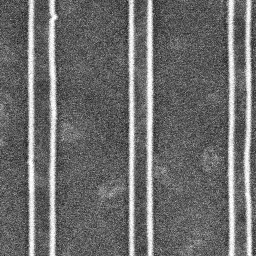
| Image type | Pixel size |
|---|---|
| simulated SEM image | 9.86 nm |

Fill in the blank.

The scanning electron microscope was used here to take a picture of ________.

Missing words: one or a few lines or trenches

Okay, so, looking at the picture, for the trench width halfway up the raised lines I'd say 786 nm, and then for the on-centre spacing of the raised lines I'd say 98.9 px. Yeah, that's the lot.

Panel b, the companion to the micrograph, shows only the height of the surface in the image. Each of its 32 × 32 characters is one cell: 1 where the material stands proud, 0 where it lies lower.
00001100000000001110000000000110
00001110000000001110000000000110
00001110000000001110000000000110
00001100000000001110000000000110
00001100000000001110000000000110
00001100000000001110000000000110
00001100000000001110000000000110
00001100000000001110000000000110
00001110000000001110000000000110
00001110000000001110000000000110
00001110000000001110000000000110
00001110000000001110000000000110
00001110000000001110000000000110
00001110000000001110000000000110
00001110000000001110000000000110
00001110000000001110000000000110
00001110000000001110000000000110
00001110000000001110000000000110
00001110000000001110000000000110
00001110000000000110000000000110
00001110000000000110000000000110
00001110000000000110000000000110
00001110000000000110000000000110
00001110000000000110000000000110
00001110000000000110000000000110
00001110000000000110000000000110
00001110000000000110000000000110
00001110000000000110000000000110
00001110000000000110000000000110
00001110000000000110000000000110
00001110000000000110000000000110
00001110000000000110000000000110